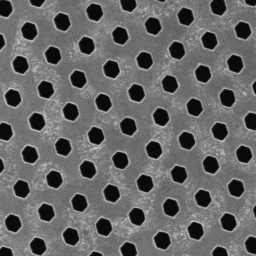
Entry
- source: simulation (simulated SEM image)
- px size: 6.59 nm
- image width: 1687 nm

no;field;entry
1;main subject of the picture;a regular array of holes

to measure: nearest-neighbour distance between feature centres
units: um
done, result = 0.223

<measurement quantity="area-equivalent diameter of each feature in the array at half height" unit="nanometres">105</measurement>